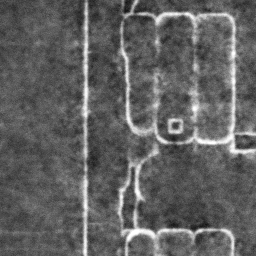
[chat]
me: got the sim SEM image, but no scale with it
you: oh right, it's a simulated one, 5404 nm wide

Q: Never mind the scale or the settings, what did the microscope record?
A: wiring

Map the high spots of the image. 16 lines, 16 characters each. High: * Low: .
*****...........
*****...*******.
*****...*******.
*****...*******.
*****...*******.
*****...*******.
*****...*******.
*****...*******.
*****.....****..
*****...........
*****...........
*****...........
*****...........
*****...........
*****.....****..
*****...*******.